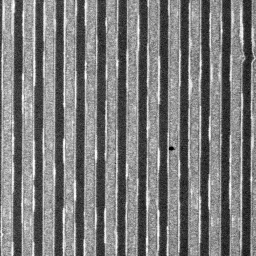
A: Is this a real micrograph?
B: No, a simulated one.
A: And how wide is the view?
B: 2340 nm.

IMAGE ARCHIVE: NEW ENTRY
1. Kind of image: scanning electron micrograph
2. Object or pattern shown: parallel lines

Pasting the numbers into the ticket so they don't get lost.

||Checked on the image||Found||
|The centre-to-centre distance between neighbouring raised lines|190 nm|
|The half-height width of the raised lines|99.4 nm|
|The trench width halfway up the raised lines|90.3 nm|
